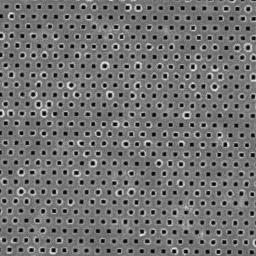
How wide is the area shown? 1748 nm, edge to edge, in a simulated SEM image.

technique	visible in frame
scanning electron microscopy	a regular array of holes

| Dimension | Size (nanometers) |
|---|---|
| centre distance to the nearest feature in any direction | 71.9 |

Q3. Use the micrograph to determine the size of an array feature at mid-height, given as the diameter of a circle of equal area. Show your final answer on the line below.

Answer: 0.0299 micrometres